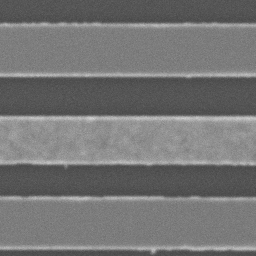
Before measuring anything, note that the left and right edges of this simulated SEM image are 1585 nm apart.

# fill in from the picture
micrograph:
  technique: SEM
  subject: lines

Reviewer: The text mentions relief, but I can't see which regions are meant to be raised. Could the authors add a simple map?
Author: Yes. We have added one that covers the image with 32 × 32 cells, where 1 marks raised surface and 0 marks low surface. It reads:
00000000000000000000000000000000
00000000000000000000000000000000
00000000000000000000000000000000
11111111111111111111111111111111
11111111111111111111111111111111
11111111111111111111111111111111
11111111111111111111111111111111
11111111111111111111111111111111
11111111111111111111111111111111
00000000000000000000000000000000
00000000000000000000000000000000
00000000000000000000000000000000
00000000000000000000000000000000
00000000000000000000000000000000
00000000000000000000000000000000
11111111111111111111111111111111
11111111111111111111111111111111
11111111111111111111111111111111
11111111111111111111111111111111
11111111111111111111111111111111
00000000000000000000000000000001
00000000000000000000000000000000
00000000000000000000000000000000
00000000000000000000000000000000
00000000000000000000000000000000
11111111111111111111111111111111
11111111111111111111111111111111
11111111111111111111111111111111
11111111111111111111111111111111
11111111111111111111111111111111
11111111111111111111111111111111
00000000000000000000000000000000